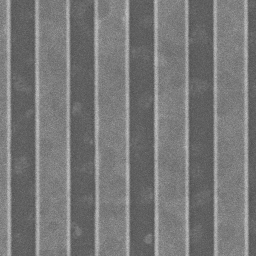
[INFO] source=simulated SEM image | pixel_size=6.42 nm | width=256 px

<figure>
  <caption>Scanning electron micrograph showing parallel lines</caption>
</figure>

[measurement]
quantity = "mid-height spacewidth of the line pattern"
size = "181 nm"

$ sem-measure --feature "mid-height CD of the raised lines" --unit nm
199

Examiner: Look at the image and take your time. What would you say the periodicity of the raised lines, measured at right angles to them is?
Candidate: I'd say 0.381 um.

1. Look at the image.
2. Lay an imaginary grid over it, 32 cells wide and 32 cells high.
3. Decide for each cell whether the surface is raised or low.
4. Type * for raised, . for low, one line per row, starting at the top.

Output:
*....***....****....***....****.
*....***....****....***....****.
*....***....****....***....****.
*....***....****....***....****.
*....***....****....***....****.
*....***....****....***....****.
*....***....****....***....****.
*....***....****....***....****.
*....***....****....***....****.
*....****...****....***....****.
*....****...****....***....****.
*....****...****....***....****.
*....****...****....***....****.
*....****...****....***....****.
*....****...****....***....****.
*....****...****....***....****.
*....****...****....***....****.
*....****...****....***....****.
*....****...****....***....****.
*....****...****....***....****.
*....****...****....***....****.
*....****...****....***....****.
*....****...****....***....****.
*....****...****....***....****.
*....****...****....***....****.
*....****...****....***....****.
*....****...****....***....****.
*....****...****....***....****.
*....****...****....***....****.
*....****...****....***....****.
*....****...****....***....****.
*....****...****....***....****.